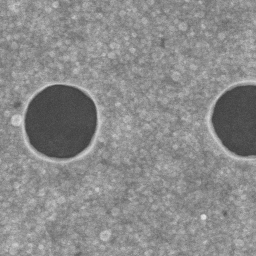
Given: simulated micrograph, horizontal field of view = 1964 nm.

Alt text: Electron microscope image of holes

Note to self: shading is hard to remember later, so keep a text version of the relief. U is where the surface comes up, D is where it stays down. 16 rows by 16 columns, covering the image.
UUUUUUUUUUUUUUUU
UUUUUUUUUUUUUUUU
UUUUUUUUUUUUUUUU
UUUUUUUUUUUUUUUU
UUUUUUUUUUUUUUUU
UUUDDUUUUUUUUUDD
UUDDDDUUUUUUUDDD
UUDDDDUUUUUUUDDD
UUDDDDUUUUUUUUDD
UUDDDUUUUUUUUUDD
UUUUUUUUUUUUUUUU
UUUUUUUUUUUUUUUU
UUUUUUUUUUUUUUUU
UUUUUUUUUUUUUUUU
UUUUUUUUUUUUUUUU
UUUUUUUUUUUUUUUU